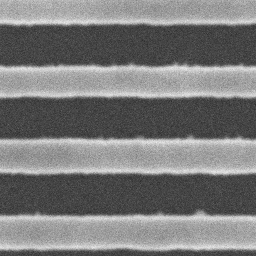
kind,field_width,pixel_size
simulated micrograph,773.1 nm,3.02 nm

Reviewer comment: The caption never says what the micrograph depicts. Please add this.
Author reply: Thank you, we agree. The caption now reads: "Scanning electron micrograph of lines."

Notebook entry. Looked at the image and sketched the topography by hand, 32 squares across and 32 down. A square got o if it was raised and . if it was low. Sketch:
oooooooooooooooooooooooooooooooo
oooooooooooooooooooooooooooooooo
oooooooooooooooooooooooooooooooo
................................
................................
................................
................................
................................
oooooooooooooooooooooooooooooooo
oooooooooooooooooooooooooooooooo
oooooooooooooooooooooooooooooooo
oooooooooooooooooooooooooooooooo
................................
................................
................................
................................
................................
.....oooooo...........o......o..
oooooooooooooooooooooooooooooooo
oooooooooooooooooooooooooooooooo
oooooooooooooooooooooooooooooooo
oooooooooooooooooooooooooooooooo
................................
................................
................................
................................
................................
oooooooooooooooooooooooooooooooo
oooooooooooooooooooooooooooooooo
oooooooooooooooooooooooooooooooo
oooooooooooooooooooooooooooooooo
................................